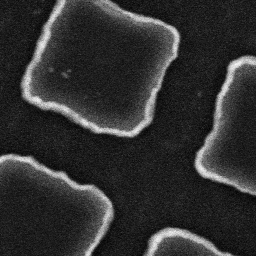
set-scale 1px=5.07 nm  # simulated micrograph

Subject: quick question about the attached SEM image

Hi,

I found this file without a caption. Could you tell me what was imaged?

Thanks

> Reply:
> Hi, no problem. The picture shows raised bodies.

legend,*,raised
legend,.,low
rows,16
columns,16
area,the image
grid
....***.........
...*******......
...********.....
..*********.....
..********....**
..********....**
..********....**
.....****.....**
.............***
.............***
***.........****
*****.........**
*******.........
*******.........
******....*.....
******...****...